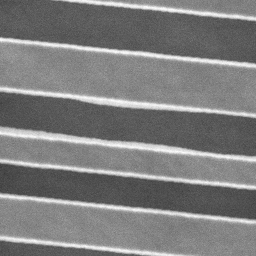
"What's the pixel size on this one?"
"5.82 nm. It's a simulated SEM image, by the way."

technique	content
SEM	lines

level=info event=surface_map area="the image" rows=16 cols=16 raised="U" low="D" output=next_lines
DDDDDDDDDUUUUUUU
DDDDDDDDDDDDDDDD
UDDDDDDDDDDDDDDD
UUUUUUUUUUDDDDDD
UUUUUUUUUUUUUUUU
UUUUUUUUUUUUUUUU
DDDDDDDDUUUUUUUU
DDDDDDDDDDDDDDDD
UUUDDDDDDDDDDDDD
UUUUUUUUUUUUDDDD
DDDUUUUUUUUUUUUU
DDDDDDDDDDDDDUUU
UUUDDDDDDDDDDDDD
UUUUUUUUUUUUUDDD
UUUUUUUUUUUUUUUU
DDDDDDUUUUUUUUUU